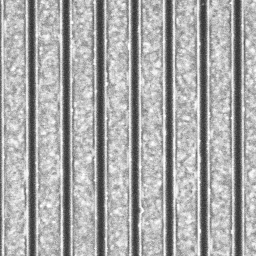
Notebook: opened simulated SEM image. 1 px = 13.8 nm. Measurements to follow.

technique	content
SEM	parallel lines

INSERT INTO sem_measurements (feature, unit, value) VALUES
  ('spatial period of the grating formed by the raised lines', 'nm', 474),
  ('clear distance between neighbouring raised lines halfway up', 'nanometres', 318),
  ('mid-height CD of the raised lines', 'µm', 0.147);